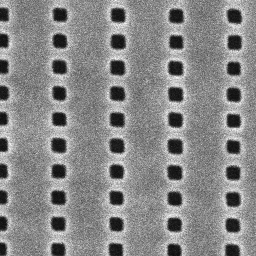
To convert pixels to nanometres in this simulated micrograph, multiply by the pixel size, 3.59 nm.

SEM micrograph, a regular array of holes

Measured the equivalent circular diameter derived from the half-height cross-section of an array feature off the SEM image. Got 16 pixels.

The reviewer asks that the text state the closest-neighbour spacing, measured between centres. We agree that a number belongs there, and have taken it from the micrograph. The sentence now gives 0.0932 µm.